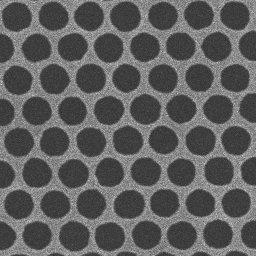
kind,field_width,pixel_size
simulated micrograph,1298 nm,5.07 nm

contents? a regular array of holes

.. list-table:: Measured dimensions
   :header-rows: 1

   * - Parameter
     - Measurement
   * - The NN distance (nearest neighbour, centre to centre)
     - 0.18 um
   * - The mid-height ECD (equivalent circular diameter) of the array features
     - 0.148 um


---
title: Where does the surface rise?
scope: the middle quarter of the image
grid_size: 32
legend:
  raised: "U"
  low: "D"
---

UUUUUDDDDUUUUUDDDUUUUUUDDDDUUUUU
UUUUDDDDDDUUUDDDDDDUUUDDDDDDUUUD
DUUDDDDDDDUUDDDDDDDUUDDDDDDDUUDD
DUUDDDDDDDDUDDDDDDDUUDDDDDDDUUDD
DUUDDDDDDDDUDDDDDDDUUDDDDDDDUUUD
DUUUDDDDDDUUUDDDDDDUUUDDDDDDUUUD
UUUUDDDDDUUUUUDDDDUUUUUDDDDUUUUU
UUUUUUUUUUUUUUUUUUUUDUUUUUUUUUUU
DDDDUUUUUDDDDUUUUUDDDDDUUUUDDDDD
DDDDDUUUDDDDDDDUUDDDDDDDUUDDDDDD
DDDDDUUUDDDDDDDUUDDDDDDDUUDDDDDD
DDDDDDUDDDDDDDDUDDDDDDDDUUDDDDDD
DDDDDDUUDDDDDDDUUDDDDDDDUUDDDDDD
DDDDDUUUDDDDDDUUUDDDDDDDUUUDDDDD
DDDDDUUUUDDDDUUUUUDDDDDUUUUUDDDU
UUUUUUUUUUUUUUUDUUUUUUUUDUUUUUUU
UUUUUDDDDUUUUDDDDDUUUUDDDDDUUUUU
DUUUDDDDDDUUDDDDDDDUUUDDDDDDUUUD
DUUDDDDDDDUUDDDDDDDDUDDDDDDDUUDD
DUUDDDDDDDDUDDDDDDDDUDDDDDDDDUDD
DUUDDDDDDDUUUDDDDDDUUUDDDDDDUUUD
DUUUDDDDDDUUUDDDDDDUUUDDDDDDUUUD
UUUUUDDDDUUUUUDDDUUUUUUUDDUUUUUU
UUUUUUUUUUUDUUUUUUUDDDUUUUUUUUUU
DDDDDUUUUDDDDDUUUUDDDDDUUUUDDDDD
DDDDDUUUDDDDDDUUUDDDDDDDUUDDDDDD
DDDDDDUUDDDDDDDUUDDDDDDDUUDDDDDD
DDDDDDUUDDDDDDDUUDDDDDDDUUDDDDDD
DDDDDDUUDDDDDDDUUDDDDDDDUUDDDDDD
DDDDDDUUUDDDDDUUUUDDDDDUUUUDDDDD
DDDDUUUUUUDDDUUUUUUUUUUUUUUUUDDU
UUUUUUDDUUUUUUUUDUUUUUUUDDDUUUUU